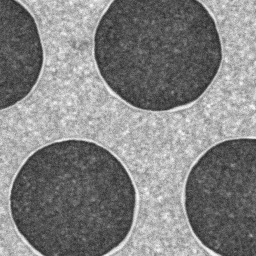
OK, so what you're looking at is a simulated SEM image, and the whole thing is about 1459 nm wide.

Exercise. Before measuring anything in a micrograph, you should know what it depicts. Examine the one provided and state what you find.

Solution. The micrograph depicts holes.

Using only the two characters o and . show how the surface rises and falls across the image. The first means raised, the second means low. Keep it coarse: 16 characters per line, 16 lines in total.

..ooooo......ooo
..oooo.......ooo
...ooo........oo
...ooo........oo
...ooo........oo
..ooooo......ooo
.ooooooo....oooo
oooooooooooooooo
oooooooooooooooo
oo.....oooooo...
o.......oooo....
o.......oooo....
o........oo.....
o.......oooo....
o.......oooo....
oo.....oooooo...